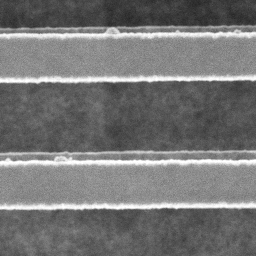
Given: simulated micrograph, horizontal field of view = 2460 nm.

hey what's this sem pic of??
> lines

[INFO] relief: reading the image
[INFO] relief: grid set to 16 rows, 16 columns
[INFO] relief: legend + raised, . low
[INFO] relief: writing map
................
................
++++++++++++++++
++++++++++++++++
++++++++++++++++
................
................
................
................
...........+..++
++++++++++++++++
++++++++++++++++
++++++++++++++++
................
................
................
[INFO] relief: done